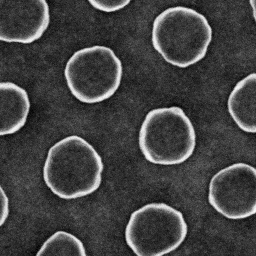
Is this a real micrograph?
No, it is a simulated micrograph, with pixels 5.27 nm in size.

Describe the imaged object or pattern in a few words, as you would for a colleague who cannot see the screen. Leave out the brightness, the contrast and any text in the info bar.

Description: raised bodies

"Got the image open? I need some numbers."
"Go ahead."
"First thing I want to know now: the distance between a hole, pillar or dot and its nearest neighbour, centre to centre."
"0.508 microns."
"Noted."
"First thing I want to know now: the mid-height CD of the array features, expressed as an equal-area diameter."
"295 nanometres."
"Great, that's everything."